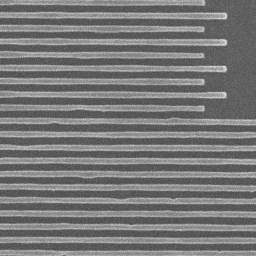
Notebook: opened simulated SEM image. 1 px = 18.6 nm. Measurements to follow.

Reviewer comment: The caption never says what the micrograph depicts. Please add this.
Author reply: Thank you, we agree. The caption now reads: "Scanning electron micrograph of parallel lines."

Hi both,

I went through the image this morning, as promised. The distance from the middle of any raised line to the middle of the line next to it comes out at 0.245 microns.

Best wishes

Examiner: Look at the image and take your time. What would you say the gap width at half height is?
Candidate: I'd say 146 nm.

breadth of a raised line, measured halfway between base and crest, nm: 97.5